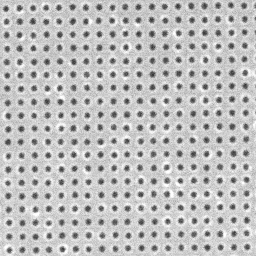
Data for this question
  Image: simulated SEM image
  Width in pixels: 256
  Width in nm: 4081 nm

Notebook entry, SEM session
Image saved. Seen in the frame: a regular array of holes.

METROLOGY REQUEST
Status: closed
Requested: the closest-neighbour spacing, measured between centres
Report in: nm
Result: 205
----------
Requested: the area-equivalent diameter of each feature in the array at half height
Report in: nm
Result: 122